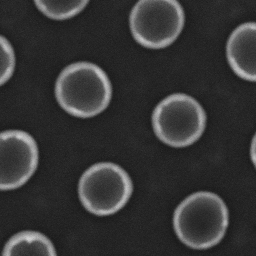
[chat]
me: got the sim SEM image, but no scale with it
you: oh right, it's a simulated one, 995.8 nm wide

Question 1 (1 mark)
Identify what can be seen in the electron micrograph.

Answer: raised bodies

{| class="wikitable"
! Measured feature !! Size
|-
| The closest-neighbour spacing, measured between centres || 390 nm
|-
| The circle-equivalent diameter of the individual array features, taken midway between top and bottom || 200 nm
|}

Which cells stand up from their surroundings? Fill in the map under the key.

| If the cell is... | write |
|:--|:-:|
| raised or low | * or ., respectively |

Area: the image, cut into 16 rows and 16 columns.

...**...***.....
........***.....
.........**...**
*.............**
*...**.........*
....***.........
....***...**....
..........***...
**........**....
**..............
**....*.........
*....***........
.....***....**..
...........***..
...........***..
***.............